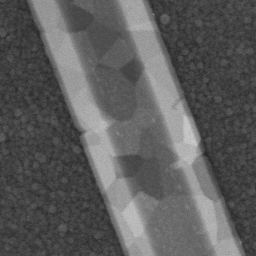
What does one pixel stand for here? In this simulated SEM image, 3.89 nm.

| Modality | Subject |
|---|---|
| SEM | one or a few lines or trenches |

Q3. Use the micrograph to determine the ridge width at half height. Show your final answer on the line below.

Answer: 305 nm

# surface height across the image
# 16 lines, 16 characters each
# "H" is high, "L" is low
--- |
LLLHHHHHLLLLLLLL
LLLHHHHHHLLLLLLL
LLLLHHHHHLLLLLLL
LLLLHHHHHLLLLLLL
LLLLLHHHHHLLLLLL
LLLLLHHHHHLLLLLL
LLLLLHHHHHHLLLLL
LLLLLLHHHHHLLLLL
LLLLLLHHHHHLLLLL
LLLLLLHHHHHHLLLL
LLLLLLLHHHHHLLLL
LLLLLLLHHHHHLLLL
LLLLLLLLHHHHHLLL
LLLLLLLLHHHHHLLL
LLLLLLLLHHHHHHLL
LLLLLLLLLHHHHHLL